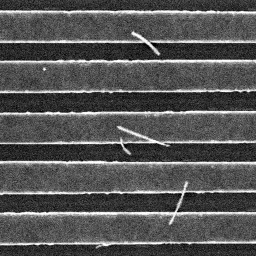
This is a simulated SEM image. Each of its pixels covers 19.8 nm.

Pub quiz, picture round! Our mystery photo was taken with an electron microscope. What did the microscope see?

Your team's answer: lines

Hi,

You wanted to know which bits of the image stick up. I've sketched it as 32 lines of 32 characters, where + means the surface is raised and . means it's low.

................................
+++++++++++++++++..++.+++.......
++++++++++++++++++++++++++++++++
++++++++++++++++++++++++++++++++
++++++++++++++++++++++++++++++++
..................+.............
................................
................................
++++++++++++++++++++++++++++++++
++++++++++++++++++++++++++++++++
++++++++++++++++++++++++++++++++
++++++++++++.++.................
................................
................................
++++++++++++++++++++++++++++++++
++++++++++++++++++++++++++++++++
++++++++++++++++++++++++++++++++
++++++++++++++++++++++++++++++++
................................
................................
++++++++++++++++++++++++++++++++
++++++++++++++++++++++++++++++++
++++++++++++++++++++++++++++++++
++++++++++++++++++++++++++++++++
................................
................................
................................
++++++++++++++++++++++++++++++++
++++++++++++++++++++++++++++++++
++++++++++++++++++++++++++++++++
+++++++......+..................
................................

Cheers